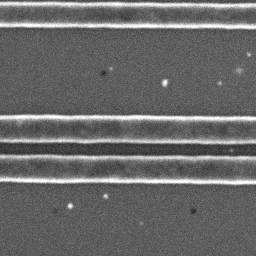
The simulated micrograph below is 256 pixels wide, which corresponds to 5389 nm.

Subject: wiring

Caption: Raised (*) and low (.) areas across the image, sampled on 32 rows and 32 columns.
********************............
********************************
********************************
................................
................................
................................
................................
................................
................................
................................
................................
................................
................................
................................
..**.**.........................
********************************
********************************
********************************
................................
**.****.........................
********************************
********************************
********************************
................................
................................
................................
................................
................................
................................
................................
................................
................................